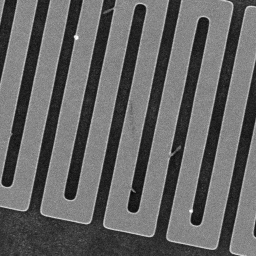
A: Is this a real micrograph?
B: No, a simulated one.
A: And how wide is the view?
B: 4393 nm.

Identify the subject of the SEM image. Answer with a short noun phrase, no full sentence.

groups of lines, slits or small figures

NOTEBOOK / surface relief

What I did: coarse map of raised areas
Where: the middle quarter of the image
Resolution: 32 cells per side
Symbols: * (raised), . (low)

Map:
.*****....*****...*****...*****.
.*****...*****....*****...*****.
.*****...*****....*****...*****.
.*****...*****...*****...******.
.*****...*****...*****...*****..
******...*****...*****...*****..
*****....****....*****...*****..
*****...*****....*****...*****..
*****...*****...*****...******..
*****...*****...*****...*****...
****....*****...*****...*****...
****...*****....*****...*****...
****...*****...*****...******...
****...*****...*****...*****....
****...*****...*****...*****...*
***....*****...*****...*****...*
***...*****....*****...*****...*
***...*****...*****....*****...*
***...*****...*****...*****....*
***...*****...*****...*****...**
**....*****...*****...*****...**
**...*****....*****...*****...**
**...*****...*****....*****...**
**...*****...*****...*****....**
**...*****...*****...*****...***
*....*****...*****...*****...***
*...******...*****...*****...***
*...*****...******...*****...***
*...*****...*****...*****....***
....*****...*****...*****...****
...******...*****...*****...****
...*****...******...*****...****